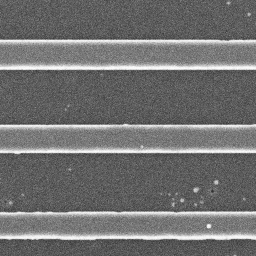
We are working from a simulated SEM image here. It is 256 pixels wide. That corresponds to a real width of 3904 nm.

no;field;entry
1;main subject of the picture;lines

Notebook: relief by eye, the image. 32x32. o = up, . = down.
................................
................................
................................
................................
................................
oooooooooooooooooooooooooooooooo
oooooooooooooooooooooooooooooooo
oooooooooooooooooooooooooooooooo
oooooooooooooooooooooooooooooooo
................................
................................
................................
................................
................................
................................
................................
oooooooooooooooooooooooooooooooo
oooooooooooooooooooooooooooooooo
oooooooooooooooooooooooooooooooo
................................
................................
................................
................................
................................
................................
................................
................................
oooooooooooooooooooooooooooooooo
oooooooooooooooooooooooooooooooo
oooooooooooooooooooooooooooooooo
................................
................................